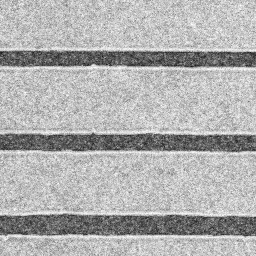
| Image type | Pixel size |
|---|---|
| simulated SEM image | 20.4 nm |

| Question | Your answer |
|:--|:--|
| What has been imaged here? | one or a few lines or trenches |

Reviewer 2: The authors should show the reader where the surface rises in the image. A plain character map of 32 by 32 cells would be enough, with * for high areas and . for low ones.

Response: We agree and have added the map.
********************************
********************************
********************************
********************************
********************************
********************************
................................
................................
*..........*....................
********************************
********************************
********************************
********************************
********************************
********************************
********************************
***********.*****...************
................................
................................
********************************
********************************
********************************
********************************
********************************
********************************
********************************
********************************
................................
................................
................................
********************************
********************************